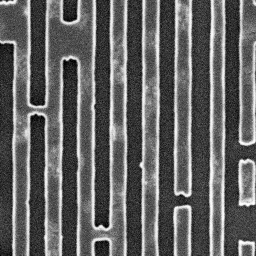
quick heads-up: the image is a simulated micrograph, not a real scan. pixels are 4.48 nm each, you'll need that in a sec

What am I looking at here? parallel lines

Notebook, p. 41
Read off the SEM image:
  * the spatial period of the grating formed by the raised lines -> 32.4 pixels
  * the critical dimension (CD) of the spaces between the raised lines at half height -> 0.0739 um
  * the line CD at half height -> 70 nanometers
